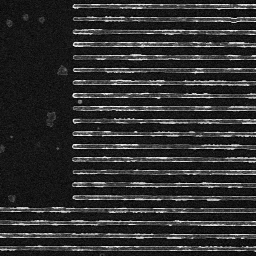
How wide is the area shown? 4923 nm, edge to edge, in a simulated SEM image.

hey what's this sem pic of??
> parallel lines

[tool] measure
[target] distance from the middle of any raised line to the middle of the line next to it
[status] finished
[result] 245 nanometers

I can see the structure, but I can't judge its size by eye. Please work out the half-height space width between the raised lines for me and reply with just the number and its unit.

161 nm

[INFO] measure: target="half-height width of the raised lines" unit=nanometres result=79.3